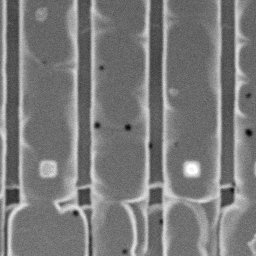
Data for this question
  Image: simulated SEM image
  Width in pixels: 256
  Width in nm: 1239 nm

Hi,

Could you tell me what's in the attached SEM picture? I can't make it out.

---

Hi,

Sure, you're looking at wiring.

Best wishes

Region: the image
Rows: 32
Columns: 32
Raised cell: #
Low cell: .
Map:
#..######...#######..######...##
#..######...#######..######...##
#..######...######...######...##
#..######...######...######...##
#..######...######...######...##
#..######...######...######...##
#..#######..######...######...##
#..#######..######..#######...##
#..######...######..#######...##
#..######...######..#######...##
#..######...######..#######...##
#..######...######...######...##
#..######...######...######...##
#..######...######...######...##
#..######...######...######...##
...######...######...######...##
...#######..######...######...##
#..######...######...######...##
#..######...######..#######...##
#..######...######..#######...##
#..######...######..#######...##
#..##..##..#######...######...##
#..######...######...######...##
#..######...######...######...##
...######...######...######...##
...#####....####.....####.....##
..########..#####....####....###
.##########.#####....#####..####
.##########.#####....#####..####
.##########.#####....#####..####
.##########.#####....#####..####
.##########.#####....#####..####